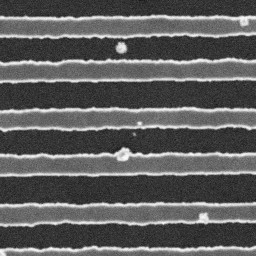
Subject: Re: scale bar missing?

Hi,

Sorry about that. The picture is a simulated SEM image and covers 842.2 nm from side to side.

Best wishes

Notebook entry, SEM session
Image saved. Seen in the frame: lines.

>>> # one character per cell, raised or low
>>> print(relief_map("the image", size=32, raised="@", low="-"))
--------------------------------
--------------------------------
@@@@@@@@@@@@@@@@@@@@@@@@@@@@@@@@
@@@@@@@@@@@@@@@@@@@@@@@@@@@@@@@@
@@@@@@@@@@@@@@@@@@@@-@--@@@@@---
--------------------------------
--------------------------------
---------------------------@@@--
@@@@@@@@@@@@@@@@@@@@@@@@@@@@@@@@
@@@@@@@@@@@@@@@@@@@@@@@@@@@@@@@@
--------------------------------
--------------------------------
--------------------------------
----------------------@@--------
@@@@@@@@@@@@@@@@@@@@@@@@@@@@@@@@
@@@@@@@@@@@@@@@@@@@@@@@@@@@@@@@@
--------------------------------
--------------------------------
--------------------------------
@@@@@@@@@@@@@@@@@@@@@@@@@@@@@@@@
@@@@@@@@@@@@@@@@@@@@@@@@@@@@@@@@
@@@@@@@@@@@@@@@@@@@@@@@@@@@@@@@@
--------------------------------
--------------------------------
--------------------------------
---@@--@@---@@@@@@@@@@@@@@@@@@@@
@@@@@@@@@@@@@@@@@@@@@@@@@@@@@@@@
@@@@@@@@@@@@@@@@@@@@@@@@@@@@@@@@
--------------------------------
--------------------------------
--------------------------------
@@@@@@@@@@@@@@@@@@@@@@@@@@@@@@@@